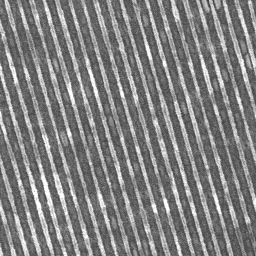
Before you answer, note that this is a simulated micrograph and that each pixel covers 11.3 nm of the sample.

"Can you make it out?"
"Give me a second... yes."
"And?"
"parallel lines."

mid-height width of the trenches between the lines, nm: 99.1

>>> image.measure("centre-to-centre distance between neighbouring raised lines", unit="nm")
139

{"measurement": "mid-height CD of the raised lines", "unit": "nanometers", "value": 39.4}